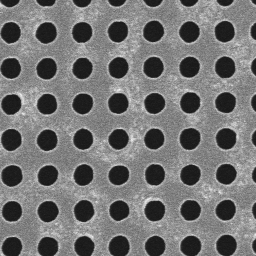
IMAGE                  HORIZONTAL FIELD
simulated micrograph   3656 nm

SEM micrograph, a regular array of holes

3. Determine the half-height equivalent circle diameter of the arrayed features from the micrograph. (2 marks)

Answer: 0.299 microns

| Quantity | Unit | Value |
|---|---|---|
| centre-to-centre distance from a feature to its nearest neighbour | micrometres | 0.506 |